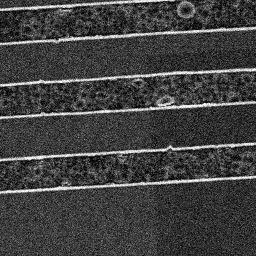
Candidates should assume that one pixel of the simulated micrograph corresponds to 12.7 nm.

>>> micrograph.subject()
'one or a few lines or trenches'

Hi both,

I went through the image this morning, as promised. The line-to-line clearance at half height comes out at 521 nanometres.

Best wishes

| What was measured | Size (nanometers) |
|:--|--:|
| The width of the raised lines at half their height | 426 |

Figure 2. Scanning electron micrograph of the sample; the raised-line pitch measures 946 nm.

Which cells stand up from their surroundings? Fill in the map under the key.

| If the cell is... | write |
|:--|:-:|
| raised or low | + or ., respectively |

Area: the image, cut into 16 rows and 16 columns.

..++++++++++++++
++++++++++++++++
++++............
................
.............+++
++++++++++++++++
++++++++++++++..
................
................
........++++++++
++++++++++++++++
+++++++++.......
................
................
................
................